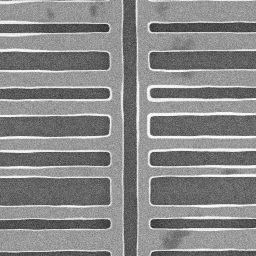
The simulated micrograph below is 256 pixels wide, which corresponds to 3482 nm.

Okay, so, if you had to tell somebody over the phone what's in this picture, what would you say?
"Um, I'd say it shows groups of lines, slits or small figures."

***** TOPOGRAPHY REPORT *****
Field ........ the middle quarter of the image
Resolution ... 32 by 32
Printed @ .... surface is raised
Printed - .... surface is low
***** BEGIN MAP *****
------------@@@---@@@-----------
-----------@@@@---@@@@@---------
@@@@@@@@@@@@@@@---@@@@@@@@@@@@@@
@@@@@@@@@@@@@@@---@@@@@@@@@@@@@@
@@@@@@@@@@@@@@@---@@@@@@@@@@@@@@
@@@@@@@@@@@@@@@---@@@@@@@@@@@@@@
-----------@@@@----@@-----------
------------@@-----@@-----------
-----------@@@-----@@-----------
@@@@@@@@@@@@@@-----@@@@@@@@@@@@@
@@@@@@@@@@@@@@-----@@@@@@@@@@@@@
@@@@@@@@@@@@@@@----@@@@@@@@@@@@@
@@@@@@@@@@@@@@@----@@@@@@@@-----
-----------@@@@---@@@-----------
------------@@@---@@@-----------
------------@@@---@@@-----------
------------@@@---@@@-----------
-----------@@@@---@@@-----------
@@@@@@@@@@@@@@@---@@@@@@@@@@@@@@
@@@@@@@@@@@@@@@---@@@@@@@@@@@@@@
@@@@@@@@@@@@@@@---@@@@@@@@@@@@@@
@@@@@@@@@@@@@@@---@@@@@@@-------
------------@@@---@@@-----------
------------@@@---@@@-----------
------------@@@---@@@-----------
-----------@@@@---@@@@----------
@@@@@@@@@@@@@@@---@@@@@@@@@@@@@@
@@@@@@@@@@@@@@@---@@@@@@@@@@@@@@
-----------@@@@---@@@@----------
------------@@@---@@@-----------
------------@@@---@@@-----------
------------@@@---@@@-----------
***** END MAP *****